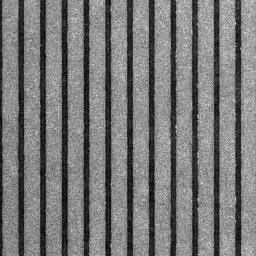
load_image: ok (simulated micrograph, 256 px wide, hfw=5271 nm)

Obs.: parallel lines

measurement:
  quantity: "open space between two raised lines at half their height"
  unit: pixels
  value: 5.75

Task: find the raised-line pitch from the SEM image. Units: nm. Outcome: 448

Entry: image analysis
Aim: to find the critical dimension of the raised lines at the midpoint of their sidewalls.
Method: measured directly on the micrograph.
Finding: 329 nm